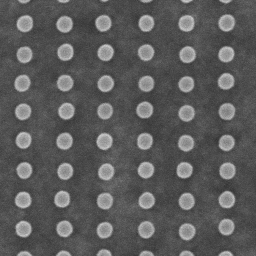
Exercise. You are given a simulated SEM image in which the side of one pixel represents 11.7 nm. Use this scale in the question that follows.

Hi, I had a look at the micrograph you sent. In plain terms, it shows a regular array of raised bodies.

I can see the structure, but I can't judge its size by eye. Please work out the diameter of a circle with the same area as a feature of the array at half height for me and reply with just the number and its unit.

180 nm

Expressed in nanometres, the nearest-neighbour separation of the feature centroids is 334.